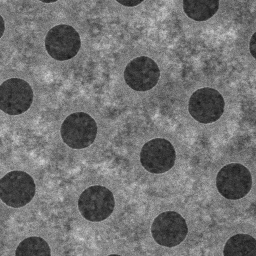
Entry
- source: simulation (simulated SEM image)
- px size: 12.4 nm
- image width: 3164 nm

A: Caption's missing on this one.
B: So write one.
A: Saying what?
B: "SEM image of a regular array of raised bodies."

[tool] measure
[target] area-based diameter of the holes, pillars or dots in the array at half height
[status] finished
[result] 0.464 micrometres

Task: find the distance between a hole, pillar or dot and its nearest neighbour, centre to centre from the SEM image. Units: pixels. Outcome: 74.6